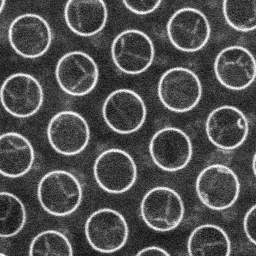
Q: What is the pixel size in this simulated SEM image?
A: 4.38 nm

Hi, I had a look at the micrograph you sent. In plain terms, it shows a regular array of raised bodies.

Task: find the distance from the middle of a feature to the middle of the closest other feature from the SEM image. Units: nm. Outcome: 262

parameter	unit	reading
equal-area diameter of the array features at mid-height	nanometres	179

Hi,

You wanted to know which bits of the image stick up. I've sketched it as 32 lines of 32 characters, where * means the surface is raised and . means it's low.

.........****...****........****
........*****....*....***...****
..***...*****........*****...***
.*****...****........*****....**
.*****.........***...*****......
..****........*****...***.......
..***.........*****.........***.
........***...*****........*****
.......*****...***.........*****
..*....*****.........***...*****
.****...****........*****...***.
*****....**....*....*****.......
*****........****...*****.......
.****........*****...***....*...
.......***...*****........****..
......*****...****........*****.
......*****.........***...*****.
***...*****........****...****..
****...***.........*****........
****.........***...*****........
****........*****...***.........
***.........*****........****...
.....****...*****........*****..
.....*****...***.........*****..
*....*****........****...****...
***..*****........*****...***...
***...***...**....*****........*
***........****...****.........*
***........*****...**....**....*
.....***...*****........****...*
....*****..****.........*****...
....*****.........**....*****...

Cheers